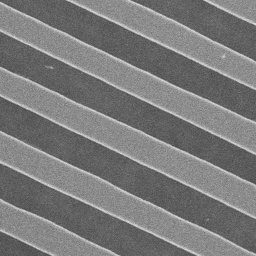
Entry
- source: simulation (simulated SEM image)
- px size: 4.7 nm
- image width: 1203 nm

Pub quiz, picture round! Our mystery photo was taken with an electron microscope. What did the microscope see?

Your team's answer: lines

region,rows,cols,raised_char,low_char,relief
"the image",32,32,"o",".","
o........oooooooo.........oooooo
ooo........ooooooooo........oooo
ooooo.........oooooooo........oo
ooooooo.........oooooooo........
.oooooooo.........oooooooo......
...oooooooo.........oooooooo....
.....oooooooo.........oooooooo..
.......oooooooo.........oooooooo
.........oooooooo.........oooooo
oo..........ooooooo.........oooo
ooooo.........ooooooo.........oo
ooooooo.........oooooooo........
.oooooooo.........oooooooo......
...oooooooo.........oooooooo....
.....oooooooo.........oooooooo..
.......ooooooooo........oooooooo
.........ooooooooo........oooooo
oo.........ooooooooo........oooo
oooo..........oooooooo........oo
oooooo..........oooooooo........
ooooooooo.........oooooooo......
..ooooooooo.........ooooooooo...
....ooooooooo.........ooooooooo.
.......oooooooo.........oooooooo
.........oooooooo.........oooooo
o..........oooooooo.........oooo
oooo.........oooooooo.........oo
oooooo.........oooooooo.........
oooooooo.........oooooooo.......
.ooooooooo.........ooooooooo....
...ooooooooo.........oooooooo...
.....ooooooooo..........ooooooo.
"